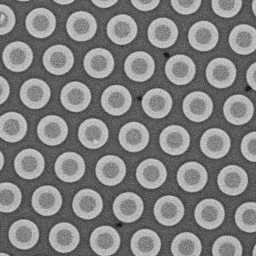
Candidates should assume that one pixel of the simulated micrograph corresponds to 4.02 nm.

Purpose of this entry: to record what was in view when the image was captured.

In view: an array of small figures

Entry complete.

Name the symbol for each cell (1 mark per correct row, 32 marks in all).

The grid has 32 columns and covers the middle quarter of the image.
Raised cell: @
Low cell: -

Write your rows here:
@@---@@@@@@@---@@@@@@@@--@@@@@@@
@----@@@@@@@---@@@@@@@---@@@@@@@
------@@@@@-----@@@@@@----@@@@@@
----------------@@@@@-----@@@@@@
---------------------------@@@@-
@@@@@@------@@------------------
@@@@@@----@@@@@@------@@@-------
@@@@@@@---@@@@@@----@@@@@@-----@
@@@@@@@--@@@@@@@@---@@@@@@@---@@
@@@@@@---@@@@@@@@---@@@@@@@---@@
@@@@@@----@@@@@@@---@@@@@@@---@@
-@@@@-----@@@@@@----@@@@@@@---@@
------------@@@------@@@@@----@@
-----------------------@-------@
-----@@@@@----------------------
@---@@@@@@-----@@@@@------@@----
@---@@@@@@@---@@@@@@@----@@@@@--
@---@@@@@@@---@@@@@@@---@@@@@@@-
----@@@@@@@---@@@@@@@---@@@@@@@-
----@@@@@@----@@@@@@@---@@@@@@@-
-----@@@@-----@@@@@@----@@@@@@@-
----------------@@@------@@@@@--
@@@-----------------------@@@---
@@@@-----@@@@@------------------
@@@@@----@@@@@@-----@@@@--------
@@@@@---@@@@@@@----@@@@@@----@@@
@@@@@---@@@@@@@---@@@@@@@----@@@
@@@@@---@@@@@@@---@@@@@@@@--@@@@
@@@@----@@@@@@@---@@@@@@@---@@@@
---------@@@@@-----@@@@@@---@@@@
--------------------@@@@-----@@@
-----@@-----------------------@@